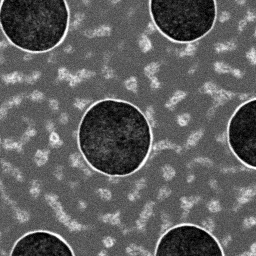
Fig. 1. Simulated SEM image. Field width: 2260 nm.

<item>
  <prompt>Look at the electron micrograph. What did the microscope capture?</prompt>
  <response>holes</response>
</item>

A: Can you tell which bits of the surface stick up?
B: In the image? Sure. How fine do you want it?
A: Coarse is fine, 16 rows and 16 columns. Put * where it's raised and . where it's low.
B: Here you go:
....*****....***
....******...***
*...*******.****
****************
****************
****************
******..*******.
*****....*****..
*****....*****..
*****....******.
******...*******
****************
****************
****************
***********..***
*...******....**